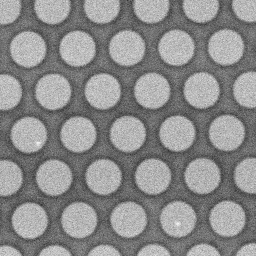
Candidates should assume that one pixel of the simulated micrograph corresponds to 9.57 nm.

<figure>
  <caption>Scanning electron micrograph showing an array of small figures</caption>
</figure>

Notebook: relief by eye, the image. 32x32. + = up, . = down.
++..+++++..++++..++++..++++..+++
++...++++..++++..++++..++++..+++
++...+++...+++....++....++....++
................................
..+++...+++...+++...++++...+++..
.+++++..++++..++++..++++..++++..
.+++++..++++..++++..++++..++++..
..+++...+++...+++....+++...+++..
................................
+.....+.....++....++....++....++
++...++++..++++..++++..++++..+++
+++.+++++..++++..++++..++++..+++
++...++++..++++..++++..++++...++
+.....+.....+...................
............................+...
..+++...+++...++++..++++...+++..
.+++++..++++..++++..++++..++++..
..++++..++++..++++..++++..++++..
..+++...+++....++....++....++...
................................
++...+++....++....+++...+++...++
+++..++++..++++..++++..++++..+++
+++..++++..++++..++++..++++..+++
++...+++...++++...+++...+++...++
................................
...+.....++....++....++....+++..
..++++..++++..++++..++++..++++..
..++++..++++..++++..++++..+++++.
..++++..++++..++++..++++...+++..
...++....++....++.....+.........
................................
++...++++..++++..++++...+++...++